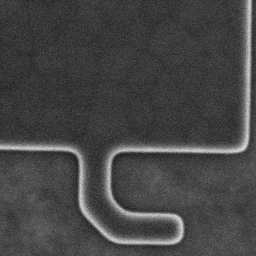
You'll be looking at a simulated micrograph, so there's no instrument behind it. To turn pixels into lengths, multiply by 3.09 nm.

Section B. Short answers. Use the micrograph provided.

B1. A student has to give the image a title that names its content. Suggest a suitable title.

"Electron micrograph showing wiring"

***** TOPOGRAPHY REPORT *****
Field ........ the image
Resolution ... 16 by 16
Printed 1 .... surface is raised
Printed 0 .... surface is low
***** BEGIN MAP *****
1111111111111111
1111111111111111
1111111111111111
1111111111111111
1111111111111111
1111111111111111
1111111111111111
1111111111111111
1111111111111111
0000111100001110
0000011000000000
0000011000000000
0000011000000000
0000011111100000
0000001111100000
0000000000000000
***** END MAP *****